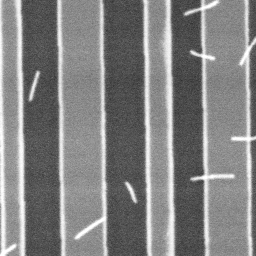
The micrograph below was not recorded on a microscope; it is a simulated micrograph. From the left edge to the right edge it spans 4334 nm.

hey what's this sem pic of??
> lines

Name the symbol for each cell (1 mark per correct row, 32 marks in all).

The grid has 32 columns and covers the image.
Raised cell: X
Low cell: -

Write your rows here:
XX-----XXXXXX-----XXX----XXXXXX-
XX-----XXXXXX-----XXX----XXXXXX-
XX-----XXXXXX-----XXX----XXXXXX-
XX-----XXXXXX-----XXX----XXXXXX-
XX-----XXXXXX-----XXX----XXXXXX-
XX-----XXXXXX-----XXX----XXXXXX-
XXX----XXXXXX-----XXX----XXXXXX-
XXX----XXXXXX-----XXX----XXXXXX-
XXX----XXXXXX-----XXX----XXXXXX-
XXX----XXXXXX-----XXX----XXXXXX-
XXX----XXXXXX-----XXX-----XXXXX-
XXX----XXXXXX-----XXX-----XXXXX-
XXX-----XXXXX-----XXX-----XXXXX-
XXX-----XXXXX-----XXX-----XXXXX-
XXX-----XXXXX-----XXX-----XXXXX-
XXX-----XXXXX-----XXX-----XXXXX-
XXX-----XXXXX-----XXX-----XXXXX-
XXX-----XXXXX-----XXX-----XXXXX-
XXX-----XXXXX-----XXX-----XXXXX-
XXX-----XXXXX-----XXX-----XXXXX-
XXX-----XXXXX-----XXX-----XXXXX-
XXX-----XXXXX-----XXX-----XXXXX-
XXX-----XXXXX-----XXX----XXXXXX-
XXX-----XXXXX------XX-----XXXXX-
XXX-----XXXXX------XXX----XXXXX-
XXX-----XXXXX------XXX----XXXXX-
XXX-----XXXXX------XXX----XXXXX-
XXX-----XXXXX------XXX----XXXXX-
XXX-----XXXXX------XXX----XXXXX-
XXX-----XXXXX------XXX----XXXXX-
XXX-----XXXXX------XXX----XXXXX-
XXX-----XXXXX------XXX----XXXXX-